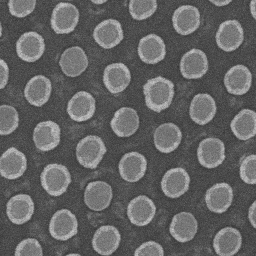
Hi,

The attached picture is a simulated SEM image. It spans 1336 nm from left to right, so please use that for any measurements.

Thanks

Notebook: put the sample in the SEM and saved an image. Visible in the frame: a regular array of raised bodies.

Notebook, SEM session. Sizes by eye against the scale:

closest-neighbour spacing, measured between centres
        233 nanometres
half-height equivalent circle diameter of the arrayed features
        148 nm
